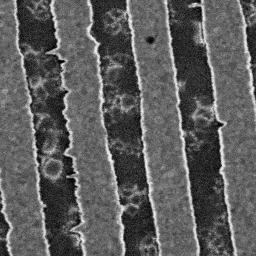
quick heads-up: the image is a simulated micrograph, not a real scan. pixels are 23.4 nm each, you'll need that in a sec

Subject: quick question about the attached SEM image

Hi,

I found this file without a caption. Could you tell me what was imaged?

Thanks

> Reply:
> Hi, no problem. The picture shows one or a few lines or trenches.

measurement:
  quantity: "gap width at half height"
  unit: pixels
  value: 36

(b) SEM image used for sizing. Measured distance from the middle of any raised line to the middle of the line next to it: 1740 nanometers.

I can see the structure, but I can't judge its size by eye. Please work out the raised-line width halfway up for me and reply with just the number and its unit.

885 nanometres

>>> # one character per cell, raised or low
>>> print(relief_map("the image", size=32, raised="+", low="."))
++.....++++.....+++++....+++++..
++.....++++.....+++++....+++++..
++.....++++.....+++++....+++++..
++.....++++.....+++++....++++++.
++.....++++......++++.....+++++.
++.....+++++.....++++.....+++++.
+++....+++++.....++++.....+++++.
+++.....++++.....+++++....+++++.
+++.....++++.....+++++....+++++.
+++.....++++.....+++++.....++++.
+++.....+++++....+++++.....++++.
++++....+++++.....++++.....+++++
++++....+++++.....++++.....+++++
++++....+++++.....++++.....+++++
++++....+++++.....++++.....+++++
++++....+++++.....+++++.....++++
++++.....++++.....+++++.....++++
++++.....++++.....+++++.....++++
++++.....++++.....+++++.....++++
++++.....+++++....+++++.....++++
+++++....+++++....+++++.....++++
+++++....+++++....+++++.....++++
+++++....+++++.....+++++....++++
+++++.....+++++....+++++....++++
+++++.....+++++....+++++....++++
+++++.....+++++....+++++....++++
+++++.....+++++....+++++.....+++
.++++.....+++++....+++++.....+++
.++++....++++++.....++++.....+++
.+++++....+++++.....++++.....+++
.+++++....+++++.....+++++....+++
.+++++....+++++.....+++++....+++